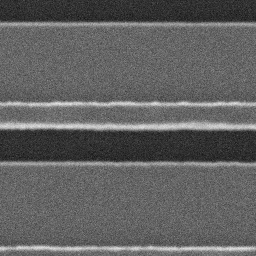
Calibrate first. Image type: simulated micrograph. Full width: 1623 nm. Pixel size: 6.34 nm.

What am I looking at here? lines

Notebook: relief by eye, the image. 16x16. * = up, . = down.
................
****************
****************
****************
****************
****************
****************
****************
................
................
****************
****************
****************
****************
****************
****************